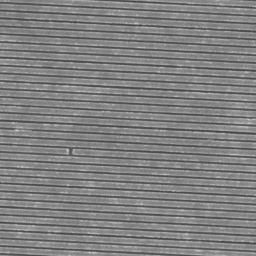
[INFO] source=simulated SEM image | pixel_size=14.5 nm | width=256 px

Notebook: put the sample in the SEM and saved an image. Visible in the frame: parallel lines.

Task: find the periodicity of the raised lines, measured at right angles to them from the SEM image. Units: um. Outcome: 0.114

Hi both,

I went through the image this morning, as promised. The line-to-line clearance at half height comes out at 25.4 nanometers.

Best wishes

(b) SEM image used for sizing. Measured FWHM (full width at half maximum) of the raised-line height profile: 85.1 nm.